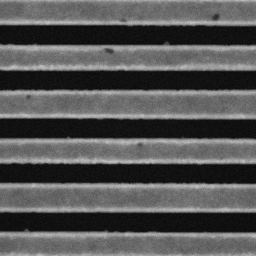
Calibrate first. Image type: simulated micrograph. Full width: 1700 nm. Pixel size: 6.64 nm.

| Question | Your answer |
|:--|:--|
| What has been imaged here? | lines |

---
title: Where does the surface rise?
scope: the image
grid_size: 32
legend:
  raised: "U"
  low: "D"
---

UUUUUUUUUUUUUUUUUUUUUUUUUUUUUUUU
UUUUUUUUUUUUUUUUUUUUUUUUUUUUUUUU
UUUUUUUUUUUUUUUUUUUUUUUUUUUUUUUU
DDDDDDDDDDDDDDDDDDDDDDDDDDDDDDDD
DDDDDDDDDDDDDDDDDDDDDDDDDDDDDDDD
DDDDDDDDDDDDDDDDDDDDDDDDDDDDDDDD
UUUUUUUUUUUUUUUUUUUUUUUUUUUUUUUU
UUUUUUUUUUUUUUUUUUUUUUUUUUUUUUUU
UUUUUUUUUUUUUUUUUUUUUUUUUUUUUUUU
DDDDDDDDDDDDDDDDDDDDDDDDDDDDDDDD
DDDDDDDDDDDDDDDDDDDDDDDDDDDDDDDD
UUUUUUUUUUUUUUUUUUUUUUUUUUUUUUUU
UUUUUUUUUUUUUUUUUUUUUUUUUUUUUUUU
UUUUUUUUUUUUUUUUUUUUUUUUUUUUUUUU
UUUUUUUUUUUUUUUUUUUUUUUUUUUUUUUU
DDDDDDDDDDDDDDDDDDDDDDDDDDDDDDDD
DDDDDDDDDDDDDDDDDDDDDDDDDDDDDDDD
UUUUUUUUUUUUUUUUUUUUUUUUUUUUUUUU
UUUUUUUUUUUUUUUUUUUUUUUUUUUUUUUU
UUUUUUUUUUUUUUUUUUUUUUUUUUUUUUUU
DDDDDDDDDDDDDDDDDDDDDDDDDDDDDDDD
DDDDDDDDDDDDDDDDDDDDDDDDDDDDDDDD
DDDDDDDDDDDDDDDDDDDDDDDDDDDDDDDD
UUUUUUUUUUUUUUUUUUUUUUUUUUUUUUUU
UUUUUUUUUUUUUUUUUUUUUUUUUUUUUUUU
UUUUUUUUUUUUUUUUUUUUUUUUUUUUUUUU
DUDDDUUUUUUUDUUUUUUUUUUUUUUUUUUU
DDDDDDDDDDDDDDDDDDDDDDDDDDDDDDDD
DDDDDDDDDDDDDDDDDDDDDDDDDDDDDDDD
UUUUUUUUUUUUUUUUUUUUUUUUUUUUUUUU
UUUUUUUUUUUUUUUUUUUUUUUUUUUUUUUU
UUUUUUUUUUUUUUUUUUUUUUUUUUUUUUUU